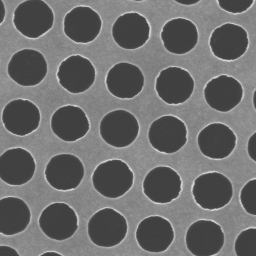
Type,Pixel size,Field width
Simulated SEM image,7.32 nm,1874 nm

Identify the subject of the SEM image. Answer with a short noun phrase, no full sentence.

a regular array of holes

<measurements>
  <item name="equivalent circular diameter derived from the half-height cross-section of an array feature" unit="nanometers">268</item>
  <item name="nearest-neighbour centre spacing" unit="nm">358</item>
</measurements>